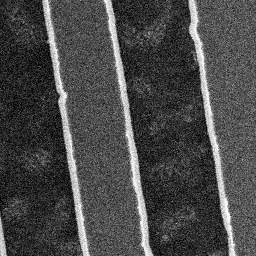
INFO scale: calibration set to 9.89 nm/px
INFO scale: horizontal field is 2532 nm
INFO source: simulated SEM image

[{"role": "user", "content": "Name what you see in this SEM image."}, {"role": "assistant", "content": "one or a few lines or trenches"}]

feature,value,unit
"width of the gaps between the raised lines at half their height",801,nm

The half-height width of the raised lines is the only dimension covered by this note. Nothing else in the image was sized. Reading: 0.621 microns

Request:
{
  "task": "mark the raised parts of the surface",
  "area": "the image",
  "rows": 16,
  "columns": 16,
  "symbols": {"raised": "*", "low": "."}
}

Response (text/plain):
...****.....****
...****.....****
...****.....****
...****.....****
....****.....***
....****.....***
....****.....***
....****.....***
....****.....***
....****......**
....****......**
.....****.....**
.....****.....**
.....****.....**
.....****.....**
.....****.....**